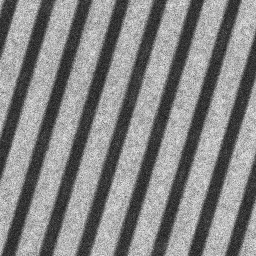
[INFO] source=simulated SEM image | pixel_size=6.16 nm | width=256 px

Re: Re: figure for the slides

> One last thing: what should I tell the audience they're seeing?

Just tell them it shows parallel lines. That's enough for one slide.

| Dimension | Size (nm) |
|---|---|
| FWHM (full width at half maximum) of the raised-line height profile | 134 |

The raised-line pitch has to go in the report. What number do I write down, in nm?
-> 220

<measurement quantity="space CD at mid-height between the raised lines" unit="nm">84.8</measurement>